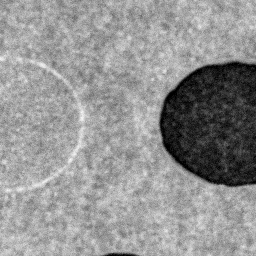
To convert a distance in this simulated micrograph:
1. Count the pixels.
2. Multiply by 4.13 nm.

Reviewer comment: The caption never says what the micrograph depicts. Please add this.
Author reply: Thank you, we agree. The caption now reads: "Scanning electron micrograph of holes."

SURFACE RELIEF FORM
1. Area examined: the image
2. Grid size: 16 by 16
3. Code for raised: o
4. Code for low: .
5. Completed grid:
oooooooooooooooo
oooooooooooooooo
oooooooooooooooo
oooooooooooooooo
oooooooooooo....
ooooooooooo.....
oooooooooo......
oooooooooo......
oooooooooo......
oooooooooo......
ooooooooooo.....
ooooooooooooo...
oooooooooooooooo
oooooooooooooooo
oooooooooooooooo
oooooooooooooooo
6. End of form